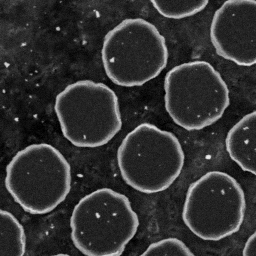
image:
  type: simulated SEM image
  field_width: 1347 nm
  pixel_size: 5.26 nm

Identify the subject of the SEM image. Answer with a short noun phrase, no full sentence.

raised bodies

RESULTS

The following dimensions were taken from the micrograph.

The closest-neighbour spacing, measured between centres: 401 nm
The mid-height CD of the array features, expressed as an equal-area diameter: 335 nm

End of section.